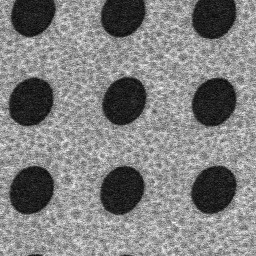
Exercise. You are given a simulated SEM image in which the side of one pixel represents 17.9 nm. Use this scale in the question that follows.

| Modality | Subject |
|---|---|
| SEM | holes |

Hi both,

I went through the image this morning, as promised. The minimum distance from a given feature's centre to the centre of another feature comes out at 1.58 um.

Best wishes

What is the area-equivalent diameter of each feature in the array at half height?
840 nanometers